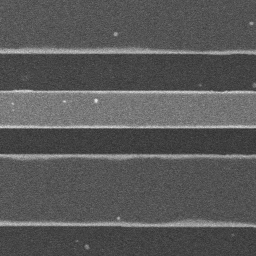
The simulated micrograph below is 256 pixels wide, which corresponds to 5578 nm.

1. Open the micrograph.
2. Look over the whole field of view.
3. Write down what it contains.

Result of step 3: lines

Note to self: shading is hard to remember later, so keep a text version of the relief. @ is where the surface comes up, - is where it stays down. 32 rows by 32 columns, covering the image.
@@@@@@@@@@@@@@@@@@@@@@@@@@@@@@@@
@@@@@@@@@@@@@@@@@@@@@@@@@@@@@@@@
@@@@@@@@@@@@@@@@@@@@@@@@@@@@@@@@
@@@@@@@@@@@@@@@@@@@@@@@@@@@@@@@@
@@@@@@@@@@@@@@@@@@@@@@@@@@@@@@@@
@@@@@@@@@@@@@@@@@@@@@@@@@@@@@@@@
@@@@@@@@@@@@@@@@@@@@@@@@@@@@@@@@
--------------------------------
--------------------------------
--------------------------------
--------------------------------
@@@@@@@@@@@@@@@@@@@@@@@@@@--@@@@
@@@@@@@@@@@@@@@@@@@@@@@@@@@@@@@@
@@@@@@@@@@@@@@@@@@@@@@@@@@@@@@@@
@@@@@@@@@@@@@@@@@@@@@@@@@@@@@@@@
@@@@@@@@@@@@@@@@@@@@@@@@@@@@@@@@
--------------------------------
--------------------------------
--------------------------------
@@@@@@@@@@@@@@@@@@@@@@@@@@@@@@@@
@@@@@@@@@@@@@@@@@@@@@@@@@@@@@@@@
@@@@@@@@@@@@@@@@@@@@@@@@@@@@@@@@
@@@@@@@@@@@@@@@@@@@@@@@@@@@@@@@@
@@@@@@@@@@@@@@@@@@@@@@@@@@@@@@@@
@@@@@@@@@@@@@@@@@@@@@@@@@@@@@@@@
@@@@@@@@@@@@@@@@@@@@@@@@@@@@@@@@
@@@@@@@@@@@@@@@@@@@@@@@@@@@@@@@@
@@@@@@@@@@@@@@@@@@@@@@@@@@@@@@@@
--------------------------------
--------------------------------
--------------------------------
--------------------------------